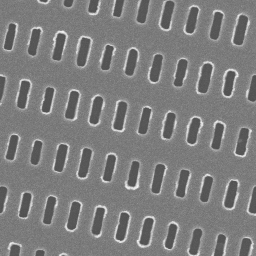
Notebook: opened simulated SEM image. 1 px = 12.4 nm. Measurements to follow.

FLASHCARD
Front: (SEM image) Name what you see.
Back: a regular array of holes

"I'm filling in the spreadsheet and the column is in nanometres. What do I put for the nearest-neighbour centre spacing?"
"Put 308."